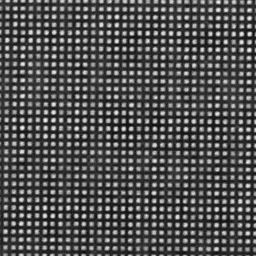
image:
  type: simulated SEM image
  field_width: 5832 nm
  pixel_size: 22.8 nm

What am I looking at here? a regular array of raised bodies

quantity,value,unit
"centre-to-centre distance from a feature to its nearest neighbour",173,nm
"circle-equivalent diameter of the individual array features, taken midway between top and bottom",99.5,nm